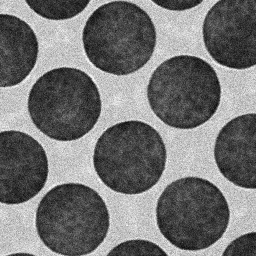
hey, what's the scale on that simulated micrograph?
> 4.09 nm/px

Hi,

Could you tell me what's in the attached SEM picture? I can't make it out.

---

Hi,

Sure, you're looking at holes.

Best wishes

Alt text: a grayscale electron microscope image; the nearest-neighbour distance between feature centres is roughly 344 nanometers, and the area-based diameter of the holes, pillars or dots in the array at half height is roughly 300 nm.